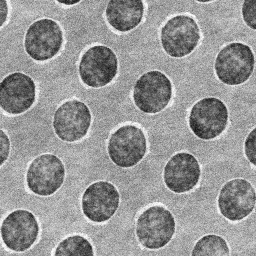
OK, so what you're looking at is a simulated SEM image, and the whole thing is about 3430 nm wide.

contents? a regular array of holes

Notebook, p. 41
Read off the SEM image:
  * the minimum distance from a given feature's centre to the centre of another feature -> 810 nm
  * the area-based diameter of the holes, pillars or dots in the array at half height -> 548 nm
